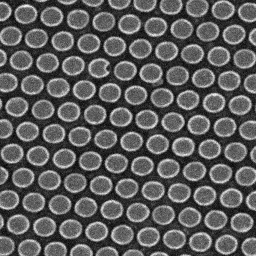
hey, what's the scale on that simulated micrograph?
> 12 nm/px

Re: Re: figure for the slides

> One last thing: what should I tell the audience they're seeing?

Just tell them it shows a regular array of raised bodies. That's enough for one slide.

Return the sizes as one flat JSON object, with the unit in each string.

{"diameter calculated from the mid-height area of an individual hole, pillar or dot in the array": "242 nanometres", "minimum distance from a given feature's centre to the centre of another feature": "311 nm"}